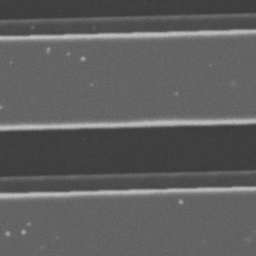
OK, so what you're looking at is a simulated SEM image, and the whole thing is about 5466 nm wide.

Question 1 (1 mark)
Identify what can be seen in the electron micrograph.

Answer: lines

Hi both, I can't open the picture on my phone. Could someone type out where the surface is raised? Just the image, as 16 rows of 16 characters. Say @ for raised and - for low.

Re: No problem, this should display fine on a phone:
----------------
@@@@@@@@@@@@@@@@
@@@@@@@@@@@@@@@@
@@@@@@@@@@@@@@@@
@@@@@@@@@@@@@@@@
@@@@@@@@@@@@@@@@
@@@@@@@@@@@@@@@@
@@@@@@@@@@@@@@@@
----------------
----------------
----------------
@@@@@@@@@@@@@@@@
@@@@@@@@@@@@@@@@
@@@@@@@@@@@@@@@@
@@@@@@@@@@@@@@@@
@@@@@@@@@@@@@@@@